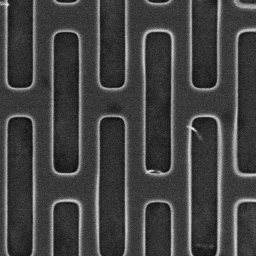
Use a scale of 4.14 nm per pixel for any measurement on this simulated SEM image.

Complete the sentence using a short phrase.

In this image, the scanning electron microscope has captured groups of lines, slits or small figures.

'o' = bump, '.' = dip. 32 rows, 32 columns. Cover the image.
o...oooooooo....oooooooo...ooo..
o...oooooooo....oooooooo...ooooo
o...oooooooo....oooooooo...ooooo
o...oooooooo....oooooooo...ooooo
o...ooo...oo....oo...ooo...ooo..
o...ooo...oo....oo....oo...ooo..
o...ooo...oo....oo...ooo...ooo..
o...ooo...oo....oo...ooo...ooo..
o...ooo...oo....oo...ooo...ooo..
o...ooo...oo....oo...ooo...ooo..
o...ooo...ooo..ooo...ooo...ooo..
ooooooo...oooooooo...ooooooooo..
ooooooo...oooooooo...ooooooooo..
ooooooo...oooooooo...ooooooooo..
oo.oooo...oooooooo...oooo.oooo..
o...ooo...oo....oo...ooo...oo...
o...ooo...oo....oo...ooo...oo...
o...ooo...oo....oo...ooo...oo...
o...ooo...oo....oo...ooo...oo...
o...ooo...oo....oo...ooo...oo...
o...ooo...oo....oo...ooo...oo...
o...ooo..ooo....ooo..ooo...ooo..
o...oooooooo....oooooooo...ooooo
o...oooooooo....oooooooo...ooooo
o...oooooooo....oooooooo...ooooo
o...ooo...oo....ooo..ooo...ooo..
o...ooo...oo....oo...ooo...oo...
o...ooo...oo....oo...ooo...oo...
o...ooo...oo....oo...ooo...oo...
o...ooo...oo....oo...ooo...oo...
o...ooo...oo....oo...ooo...oo...
o...ooo...oo....oo...ooo...oo...